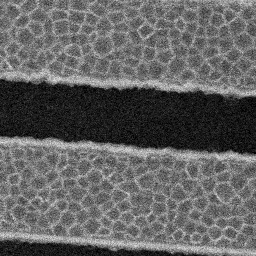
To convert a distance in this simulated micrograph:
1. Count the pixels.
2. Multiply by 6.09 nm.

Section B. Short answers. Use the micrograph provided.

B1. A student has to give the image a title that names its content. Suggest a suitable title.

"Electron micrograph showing one or a few lines or trenches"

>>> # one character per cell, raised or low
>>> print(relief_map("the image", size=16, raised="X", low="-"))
XXXXXXXXXXXXXXXX
XXXXXXXXXXXXXXXX
XXXXXXXXXXXXXXXX
XXXXXXXXXXXXXXXX
XXXXXXXXXXXXXXXX
-------------XXX
----------------
----------------
----------------
XXXXXXXXXX------
XXXXXXXXXXXXXXXX
XXXXXXXXXXXXXXXX
XXXXXXXXXXXXXXXX
XXXXXXXXXXXXXXXX
XXXXXXXXXXXXXXXX
-----------XXXXX